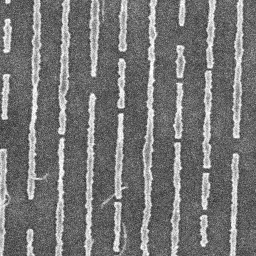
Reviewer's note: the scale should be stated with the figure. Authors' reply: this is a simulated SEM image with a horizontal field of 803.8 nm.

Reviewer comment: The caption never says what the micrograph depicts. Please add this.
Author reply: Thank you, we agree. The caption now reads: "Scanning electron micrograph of parallel lines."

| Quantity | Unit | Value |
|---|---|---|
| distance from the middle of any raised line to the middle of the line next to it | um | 0.0911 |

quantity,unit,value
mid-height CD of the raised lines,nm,17.7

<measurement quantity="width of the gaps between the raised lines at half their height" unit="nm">74.2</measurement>